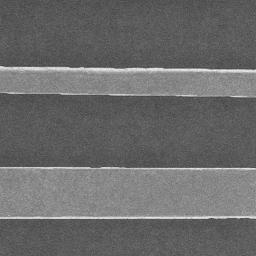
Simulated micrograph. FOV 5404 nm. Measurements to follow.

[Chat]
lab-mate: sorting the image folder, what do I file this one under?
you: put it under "lines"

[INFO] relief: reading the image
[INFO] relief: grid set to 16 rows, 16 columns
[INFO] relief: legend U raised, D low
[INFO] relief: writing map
DDDDDDDDDDDDDDDD
DDDDDDDDDDDDDDDD
DDDDDDDDDDDDDDDD
DDDDDDDDDDDDDDDD
UUUUUUUUUUUUUUUU
UUUUUUUUUUUUUUUU
DDDDDDDDDDDDDDDD
DDDDDDDDDDDDDDDD
DDDDDDDDDDDDDDDD
DDDDDDDDDDDDDDDD
UUUUUUUUDDDDDDDD
UUUUUUUUUUUUUUUU
UUUUUUUUUUUUUUUU
UUUUUUUUUUUUUUUU
DDDDDDDDDDDDDDDD
DDDDDDDDDDDDDDDD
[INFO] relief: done